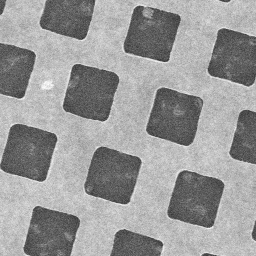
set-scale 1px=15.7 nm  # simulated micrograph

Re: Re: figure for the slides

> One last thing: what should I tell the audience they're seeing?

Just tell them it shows holes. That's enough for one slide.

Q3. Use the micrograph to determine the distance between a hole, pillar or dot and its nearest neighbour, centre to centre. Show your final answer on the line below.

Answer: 1340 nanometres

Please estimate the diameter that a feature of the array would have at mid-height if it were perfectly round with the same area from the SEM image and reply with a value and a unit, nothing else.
55.5 px